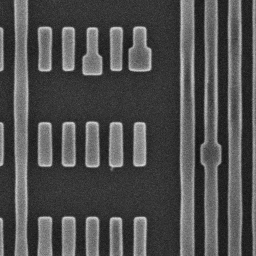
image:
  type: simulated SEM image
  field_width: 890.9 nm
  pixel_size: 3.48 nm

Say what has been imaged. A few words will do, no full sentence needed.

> wiring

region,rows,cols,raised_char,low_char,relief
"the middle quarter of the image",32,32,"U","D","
UUUDDUUUUDDDUUDDUUUUUUDDDDDDDUUU
DDDDDUUUUDDDDDDDDUUUUDDDDDDDDUDU
DDDDDUUUUDDDDDDDDDDDDDDDDDDDDUDD
DDDDDDDDDDDDDDDDDDDDDDDDDDDDDUDD
DDDDDDDDDDDDDDDDDDDDDDDDDDDDDUDD
DDDDDDDDDDDDDDDDDDDDDDDDDDDDDUDD
DDDDDDDDDDDDDDDDDDDDDDDDDDDDDUDD
DDDDDDDDDDDDDDDDDDDDDDDDDDDDDUDU
DDDDDDDDDDDDDDDDDDDDDDDDDDDDDUUU
DDDDDDDDDDDDDDDDDDDDDDDDDDDDDUUU
DDDDDDDDDDDDDDDDDDDDDDDDDDDDDUUU
DDDDDDDDDDDDDDDDDDDDDDDDDDDDDUUU
DDDDDDDDDDDDDDDDDDDDDDDDDDDDDUUU
DDDDDDDDDDDDDDDDDDDDDDDDDDDDDUUU
DDDDDDUUDDDDDDDDDDDDDDDDDDDDDUUU
UUUDDDUUUDDDUUDDDDUUDDDDDDDDDUUU
UUUDDDUUUDDDUUDDDDUUDDDDDDDDDUUU
UUUDDDUUUDDDUUDDDDUUDDDDDDDDDUUU
UUUDDDUUUDDDUUDDDDUUDDDDDDDDDUUU
UUUDDDUUUDDDUUDDDDUUDDDDDDDDDUUU
UUUDDUUUUDDDUUDDDUUUDDDDDDDDDUUU
UUUDDUUUUDDUUUDDDUUUDDDDDDDDDUUU
UUUDDUUUUDDUUUUDDUUUDDDDDDDDDUUU
UUUDDUUUUDDUUUUDDUUUDDDDDDDDDUUU
UUUDDUUUUDDUUUUDDUUUDDDDDDDDDUUU
DDDDDDUUDDDDUUDDDDDDDDDDDDDDDUUU
DDDDDDDDDDDDDDDDDDDDDDDDDDDDDUUU
DDDDDDDDDDDDDDDDDDDDDDDDDDDDDUUU
DDDDDDDDDDDDDDDDDDDDDDDDDDDDDUUU
DDDDDDDDDDDDDDDDDDDDDDDDDDDDDUUU
DDDDDDDDDDDDDDDDDDDDDDDDDDDDDUUU
DDDDDDDDDDDDDDDDDDDDDDDDDDDDDUUU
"